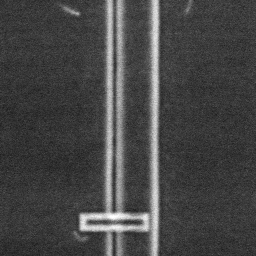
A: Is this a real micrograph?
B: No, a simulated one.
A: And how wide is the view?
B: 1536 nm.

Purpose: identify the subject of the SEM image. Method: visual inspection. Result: wiring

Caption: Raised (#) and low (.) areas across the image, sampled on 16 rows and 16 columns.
##########......
##########......
##########......
##########......
##########......
##########......
##########......
##########......
##########......
##########......
##########......
##########......
##########......
##########......
##########......
##########......